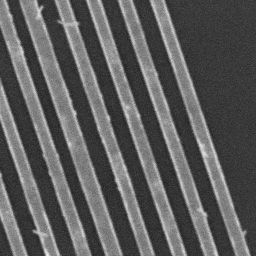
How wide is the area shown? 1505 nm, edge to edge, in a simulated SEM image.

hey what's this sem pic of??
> parallel lines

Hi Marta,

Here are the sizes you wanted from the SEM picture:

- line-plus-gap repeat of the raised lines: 177 nm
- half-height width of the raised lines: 12.8 pixels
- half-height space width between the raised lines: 102 nanometres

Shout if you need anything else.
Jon